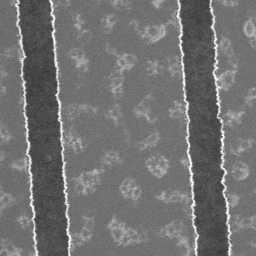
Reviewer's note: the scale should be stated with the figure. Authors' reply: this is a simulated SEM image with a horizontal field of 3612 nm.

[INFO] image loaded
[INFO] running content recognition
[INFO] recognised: one or a few lines or trenches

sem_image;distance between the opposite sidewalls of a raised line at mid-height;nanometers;477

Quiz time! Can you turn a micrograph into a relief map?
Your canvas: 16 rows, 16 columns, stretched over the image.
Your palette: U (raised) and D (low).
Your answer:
DUUDDDDDDDDUUDDD
DUUDDDDDDDDUUDDD
DUUDDDDDDDDUUDDD
DUUDDDDDDDDUUUDD
DUUUDDDDDDDUUDDD
DUUUDDDDDDDUUUDD
DDUUDDDDDDDDUUDD
DDUUDDDDDDDDUUDD
DDUUDDDDDDDDUUDD
DDUUDDDDDDDDUUDD
DDUUDDDDDDDDUUDD
DDUUDDDDDDDDUUDD
DDUUDDDDDDDDUUDD
DDUUDDDDDDDDUUDD
DDUUDDDDDDDDUUDD
DDUUDDDDDDDDUUDD